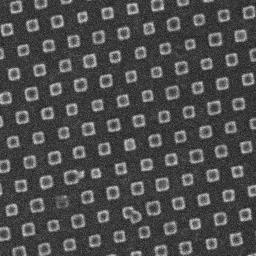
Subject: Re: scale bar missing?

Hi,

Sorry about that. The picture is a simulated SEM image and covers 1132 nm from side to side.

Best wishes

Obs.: a regular array of raised bodies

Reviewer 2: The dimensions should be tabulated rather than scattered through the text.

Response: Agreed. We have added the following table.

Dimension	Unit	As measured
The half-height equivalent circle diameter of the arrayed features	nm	53.4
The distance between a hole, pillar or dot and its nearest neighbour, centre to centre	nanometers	111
